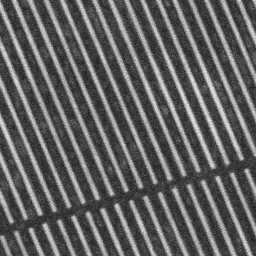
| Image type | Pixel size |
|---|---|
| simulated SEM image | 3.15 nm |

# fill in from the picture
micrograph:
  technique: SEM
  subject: parallel lines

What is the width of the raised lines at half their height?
11.2 nm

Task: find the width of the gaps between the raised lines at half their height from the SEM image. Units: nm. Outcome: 36.3